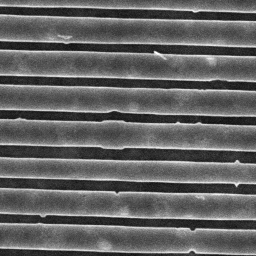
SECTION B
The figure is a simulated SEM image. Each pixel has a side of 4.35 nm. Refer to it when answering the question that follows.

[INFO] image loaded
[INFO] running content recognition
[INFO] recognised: parallel lines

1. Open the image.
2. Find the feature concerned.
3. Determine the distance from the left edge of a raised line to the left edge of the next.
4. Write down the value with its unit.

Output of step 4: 151 nanometers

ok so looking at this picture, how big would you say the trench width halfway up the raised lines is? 41.3 nm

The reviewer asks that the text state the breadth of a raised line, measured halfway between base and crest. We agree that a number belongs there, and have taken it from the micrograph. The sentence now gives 24.9 px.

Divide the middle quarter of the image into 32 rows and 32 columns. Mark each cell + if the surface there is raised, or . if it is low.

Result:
++++++++++++++++++++++++++++++++
++++++++++++++++++++++++++++++++
++++++++++++++++++++++++++++++++
.................+++++++++++++++
................................
................................
+++++++++++++++++++++++++.++++++
++++++++++++++++++++++++++++++++
++++++++++++++++++++++++++++++++
++++++++++++++++++++++++++++++++
++++++++++++++++++++++++++++++++
++++++++++++++++++++++++++++++++
.........................+++++++
................................
+++......++++++.................
++++++++++++++++++++++++++++++++
++++++++++++++++++++++++++++++++
++++++++++++++++++++++++++++++++
++++++++++++++++++++++++++++++++
++++++++++++++++++++++++++++++++
....++++++++++++++++++++++++++++
................................
................................
................................
++++++++++++++++++++++++++++++++
++++++++++++++++++++++++++++++++
++++++++++++++++++++++++++++++++
++++++++++++++++++++++++++++++++
++++++++++++++++++++++++++++++++
.............................+++
................................
................................